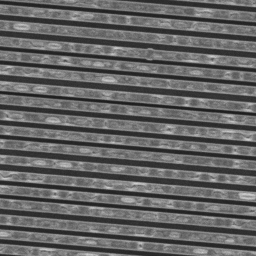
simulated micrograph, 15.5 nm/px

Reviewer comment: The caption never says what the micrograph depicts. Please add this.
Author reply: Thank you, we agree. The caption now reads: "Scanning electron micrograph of parallel lines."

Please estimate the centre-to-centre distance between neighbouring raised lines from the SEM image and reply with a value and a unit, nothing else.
0.231 microns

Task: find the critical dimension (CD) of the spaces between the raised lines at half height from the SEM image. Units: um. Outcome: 0.0752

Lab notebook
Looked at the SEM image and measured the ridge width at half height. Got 0.15 micrometres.